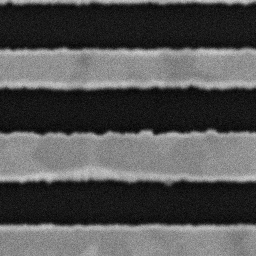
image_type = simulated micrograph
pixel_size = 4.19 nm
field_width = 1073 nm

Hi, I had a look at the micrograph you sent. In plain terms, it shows lines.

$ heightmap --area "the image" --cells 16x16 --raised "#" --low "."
................
................
................
################
################
...###.......#..
................
................
################
################
################
................
................
................
################
################